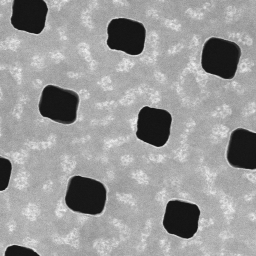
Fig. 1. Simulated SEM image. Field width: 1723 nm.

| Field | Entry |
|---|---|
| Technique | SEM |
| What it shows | holes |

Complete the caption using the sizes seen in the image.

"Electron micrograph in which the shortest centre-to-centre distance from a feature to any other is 638 nanometers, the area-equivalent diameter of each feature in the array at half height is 38.4 px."